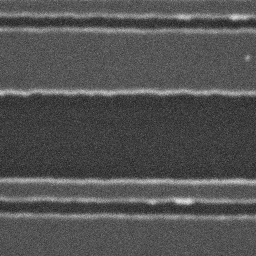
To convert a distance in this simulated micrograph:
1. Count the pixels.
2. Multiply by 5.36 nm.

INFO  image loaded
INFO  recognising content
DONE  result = lines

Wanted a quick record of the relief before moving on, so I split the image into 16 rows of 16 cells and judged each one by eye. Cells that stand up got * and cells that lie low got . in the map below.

****************
****************
****************
****************
****************
****************
................
................
................
................
................
****************
****************
****************
****************
****************